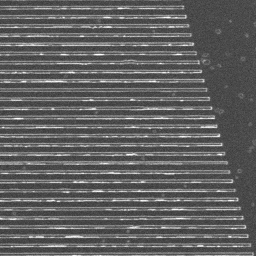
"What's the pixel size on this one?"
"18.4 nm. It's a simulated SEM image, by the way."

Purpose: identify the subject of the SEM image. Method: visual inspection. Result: parallel lines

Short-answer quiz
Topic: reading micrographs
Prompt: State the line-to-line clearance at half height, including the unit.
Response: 115 nm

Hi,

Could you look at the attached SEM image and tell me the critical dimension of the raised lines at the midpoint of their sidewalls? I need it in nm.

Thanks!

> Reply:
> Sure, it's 52.8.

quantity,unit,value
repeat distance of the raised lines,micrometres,0.168